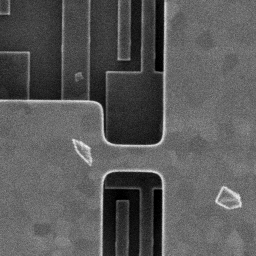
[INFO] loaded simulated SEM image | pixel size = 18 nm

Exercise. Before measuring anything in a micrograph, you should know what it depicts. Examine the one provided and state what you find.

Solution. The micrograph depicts wiring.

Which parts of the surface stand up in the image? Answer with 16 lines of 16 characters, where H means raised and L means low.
LLLLLLLLLLHHHHHH
LLLLLLLLLLHHHHHH
LLLLLLLLLLHHHHHH
LLLLLLLLLLHHHHHH
LLLLLLLLLLHHHHHH
LLLLLLLLLLHHHHHH
HHHHHHLLLLHHHHHH
HHHHHHLLLLHHHHHH
HHHHHHHLLLHHHHHH
HHHHHHHHHHHHHHHH
HHHHHHHHHHHHHHHH
HHHHHHLLLLHHHHHH
HHHHHHLLLLHHHHHH
HHHHHHLLLLHHHHHH
HHHHHHLLLLHHHHHH
HHHHHHLLLLHHHHHH